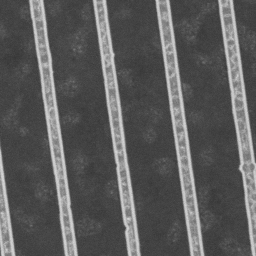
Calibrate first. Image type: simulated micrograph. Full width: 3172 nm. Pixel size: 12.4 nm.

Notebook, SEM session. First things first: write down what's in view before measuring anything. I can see one or a few lines or trenches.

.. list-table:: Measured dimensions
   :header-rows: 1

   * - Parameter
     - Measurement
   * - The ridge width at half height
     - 127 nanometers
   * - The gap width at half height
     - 642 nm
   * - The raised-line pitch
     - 62.5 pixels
